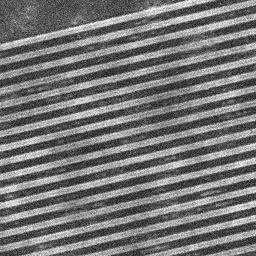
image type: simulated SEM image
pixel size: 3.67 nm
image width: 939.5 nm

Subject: parallel lines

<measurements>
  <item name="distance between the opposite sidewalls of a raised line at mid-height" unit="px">5.26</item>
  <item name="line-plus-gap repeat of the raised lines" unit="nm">51.5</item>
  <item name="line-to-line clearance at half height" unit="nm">31.7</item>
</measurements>